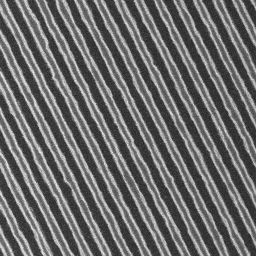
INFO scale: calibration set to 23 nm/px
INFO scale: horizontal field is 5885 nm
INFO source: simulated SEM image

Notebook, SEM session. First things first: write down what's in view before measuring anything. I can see parallel lines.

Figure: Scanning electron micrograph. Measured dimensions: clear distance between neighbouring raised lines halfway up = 239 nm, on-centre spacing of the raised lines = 406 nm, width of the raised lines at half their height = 0.165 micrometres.